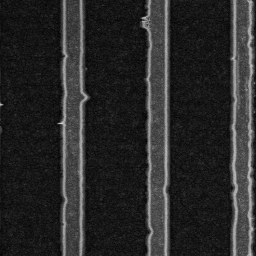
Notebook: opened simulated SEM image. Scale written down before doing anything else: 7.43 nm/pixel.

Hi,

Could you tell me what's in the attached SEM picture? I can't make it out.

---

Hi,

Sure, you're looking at one or a few lines or trenches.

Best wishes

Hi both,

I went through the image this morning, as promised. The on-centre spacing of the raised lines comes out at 630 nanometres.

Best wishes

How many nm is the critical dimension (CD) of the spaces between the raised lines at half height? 505